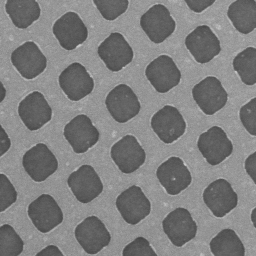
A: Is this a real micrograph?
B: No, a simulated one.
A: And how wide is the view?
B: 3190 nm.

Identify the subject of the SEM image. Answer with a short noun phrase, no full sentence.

a regular array of holes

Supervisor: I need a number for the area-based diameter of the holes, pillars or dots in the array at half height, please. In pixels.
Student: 35.7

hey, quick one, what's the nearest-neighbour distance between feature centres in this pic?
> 626 nanometers